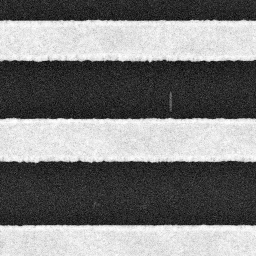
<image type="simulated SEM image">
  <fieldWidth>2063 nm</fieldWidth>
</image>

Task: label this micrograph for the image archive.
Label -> lines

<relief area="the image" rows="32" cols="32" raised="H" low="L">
LLLLLLLLLLLLLLLLLLLLLLLLLLLLLLLL
LLLLLLLLLLLLLLLLLLLLLLLLLLLLLLLL
LLLLLLLLLLLLLLLLLLLLLLLLLLLLLLLL
HHHHHHHHHHHHHHHHHHHHHHHHHHHHHHHH
HHHHHHHHHHHHHHHHHHHHHHHHHHHHHHHH
HHHHHHHHHHHHHHHHHHHHHHHHHHHHHHHH
HHHHHHHHHHHHHHHHHHHHHHHHHHHHHHHH
HHHHHHLLLLHHHHHHHHHHHHLHHHHHHHHH
LLLLLLLLLLLLLLLLLLLLLLLLLLLLLLLL
LLLLLLLLLLLLLLLLLLLLLLLLLLLLLLLL
LLLLLLLLLLLLLLLLLLLLLLLLLLLLLLLL
LLLLLLLLLLLLLLLLLLLLLLLLLLLLLLLL
LLLLLLLLLLLLLLLLLLLLLLLLLLLLLLLL
LLLLLLLLLLLLLLLLLLLLLLLLLLLLLLLL
LLLLLLLLLLLLLLLLLLLLLLLLLLLLLLLL
HHHHHHHHHHHHHHHHHHHHHHHHHHHHHHHH
HHHHHHHHHHHHHHHHHHHHHHHHHHHHHHHH
HHHHHHHHHHHHHHHHHHHHHHHHHHHHHHHH
HHHHHHHHHHHHHHHHHHHHHHHHHHHHHHHH
HHHHHHHHHHHHHHHHHHHHHHHHHHHHHHHH
LLLLLLLLLLLLLLLLLLLLLLLLLLLLLLLL
LLLLLLLLLLLLLLLLLLLLLLLLLLLLLLLL
LLLLLLLLLLLLLLLLLLLLLLLLLLLLLLLL
LLLLLLLLLLLLLLLLLLLLLLLLLLLLLLLL
LLLLLLLLLLLLLLLLLLLLLLLLLLLLLLLL
LLLLLLLLLLLLLLLLLLLLLLLLLLLLLLLL
LLLLLLLLLLLLLLLLLLLLLLLLLLLLLLLL
LLLLLLLLLLLLLLLLLLLLLLLLLLLLLLLL
HHHHHHHHHHHHHHHHHHHHHHHHHHHHHHHH
HHHHHHHHHHHHHHHHHHHHHHHHHHHHHHHH
HHHHHHHHHHHHHHHHHHHHHHHHHHHHHHHH
HHHHHHHHHHHHHHHHHHHHHHHHHHHHHHHH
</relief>